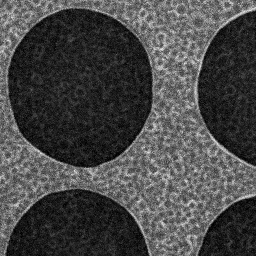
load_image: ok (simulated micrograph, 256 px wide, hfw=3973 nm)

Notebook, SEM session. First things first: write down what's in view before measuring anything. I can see holes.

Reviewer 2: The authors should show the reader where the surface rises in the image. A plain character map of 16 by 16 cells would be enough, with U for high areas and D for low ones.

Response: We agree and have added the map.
UUUUUUUUUUUUUUUU
UUDDDDDDUUUUUUDD
UDDDDDDDDUUUUDDD
UDDDDDDDDUUUUDDD
DDDDDDDDDDUUDDDD
DDDDDDDDDDUUDDDD
UDDDDDDDDDUUDDDD
UDDDDDDDDUUUUDDD
UDDDDDDDDUUUUDDD
UUUDDDDDUUUUUUDD
UUUUUUUUUUUUUUUU
UUUUUUUUUUUUUUUU
UUDDDDDUUUUUUUUD
UDDDDDDDUUUUUUDD
UDDDDDDDDUUUUDDD
DDDDDDDDDUUUUDDD